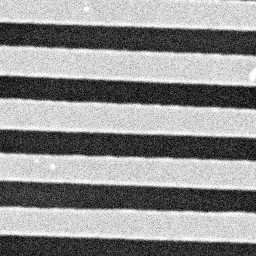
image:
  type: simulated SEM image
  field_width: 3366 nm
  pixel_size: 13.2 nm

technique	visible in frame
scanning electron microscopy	lines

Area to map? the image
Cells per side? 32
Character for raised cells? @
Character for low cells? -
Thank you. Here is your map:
@@@@@@@@@@@@@@@@@@@@@@@@@@@@@@@@
@@@@@@@@@@@@@@@@@@@@@@@@@@@@@@@@
@@@@@@@@@@@@@@@@@@@@@@@@@@@@@@@@
---------------------------@@@@@
--------------------------------
--------------------------------
@@@@@@@@@@@@@@@@----------------
@@@@@@@@@@@@@@@@@@@@@@@@@@@@@@@@
@@@@@@@@@@@@@@@@@@@@@@@@@@@@@@@@
----@@@@@@@@@@@@@@@@@@@@@@@@@@@@
----------------------------@@@@
--------------------------------
@@@-----------------------------
@@@@@@@@@@@@@@@@@@@@@@@@--------
@@@@@@@@@@@@@@@@@@@@@@@@@@@@@@@@
@@@@@@@@@@@@@@@@@@@@@@@@@@@@@@@@
--------------@@@@@@@@@@@@@@@@@@
--------------------------------
--------------------------------
@@@@@@@-------------------------
@@@@@@@@@@@@@@@@@@@@@@@@@@@@@@@@
@@@@@@@@@@@@@@@@@@@@@@@@@@@@@@@@
---@@@@@@@@@@@@@@@@@@@@@@@@@@@@@
---------------------------@@@@@
--------------------------------
--------------------------------
@@@@@@@@@@@@@@@@@@@@------------
@@@@@@@@@@@@@@@@@@@@@@@@@@@@@@@@
@@@@@@@@@@@@@@@@@@@@@@@@@@@@@@@@
---------@@@@@@@@@@@@@@@@@@@@@@@
--------------------------------
--------------------------------